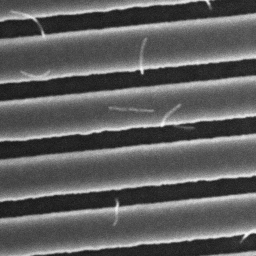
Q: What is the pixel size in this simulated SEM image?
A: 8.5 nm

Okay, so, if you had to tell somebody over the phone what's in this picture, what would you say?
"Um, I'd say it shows lines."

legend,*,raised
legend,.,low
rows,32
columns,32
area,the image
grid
**********************..........
************....................
*..........................*****
...............*****************
.....***************************
********************************
********************************
******************************..
********************............
*********.......................
........................********
..............******************
...*****************************
********************************
********************************
**********************..........
*************...................
***.......................******
................****************
......**************************
********************************
********************************
***************************.....
****************................
******........................**
....................************
..........**********************
********************************
********************************
*****************************...
******************..............
*********.......................